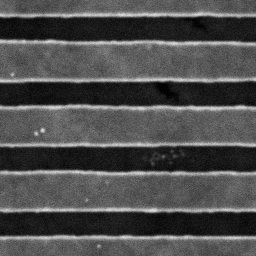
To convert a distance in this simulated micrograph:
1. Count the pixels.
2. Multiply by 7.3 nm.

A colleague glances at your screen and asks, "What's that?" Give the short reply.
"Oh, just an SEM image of lines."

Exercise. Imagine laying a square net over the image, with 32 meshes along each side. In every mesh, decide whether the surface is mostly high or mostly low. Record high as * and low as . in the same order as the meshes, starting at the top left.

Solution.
********************************
********************************
................................
................................
................................
********************************
********************************
********************************
********************************
********************************
................................
................................
................................
********************************
********************************
********************************
********************************
********************************
................................
................................
................................
*...********....................
********************************
********************************
********************************
********************************
................................
................................
................................
................................
********************************
********************************